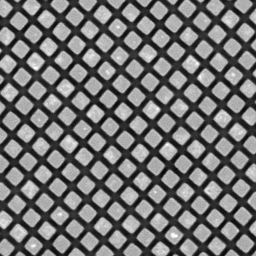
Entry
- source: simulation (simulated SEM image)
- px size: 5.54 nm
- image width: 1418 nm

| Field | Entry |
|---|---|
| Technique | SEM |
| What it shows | a regular array of raised bodies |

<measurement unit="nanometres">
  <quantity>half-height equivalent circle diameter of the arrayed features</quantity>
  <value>89.7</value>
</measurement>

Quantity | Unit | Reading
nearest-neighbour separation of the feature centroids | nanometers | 109